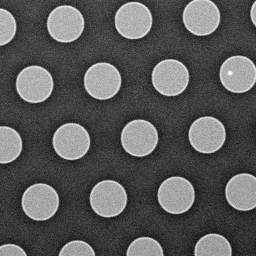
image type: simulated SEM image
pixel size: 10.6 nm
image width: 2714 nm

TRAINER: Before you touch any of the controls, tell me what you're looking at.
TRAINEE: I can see an array of small figures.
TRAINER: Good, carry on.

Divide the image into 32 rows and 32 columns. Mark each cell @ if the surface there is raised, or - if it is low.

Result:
----------------@@------@@@-----
@------@@@-----@@@@----@@@@----@
@@----@@@@----@@@@@----@@@@-----
@@----@@@@-----@@@@----@@@@-----
@@-----@@@-----@@@--------------
--------------------------------
--------------------------------
----------------------------@@@-
---@@------@@@-----@@@@-----@@@@
--@@@@-----@@@@----@@@@@----@@@@
--@@@@@----@@@@----@@@@-----@@@@
--@@@@-----@@@@-----@@@------@--
---@@---------------------------
--------------------------------
--------------------------------
----------------@@@-----@@@@----
@@-----@@@@----@@@@@----@@@@----
@@@----@@@@----@@@@@----@@@@----
@@@----@@@@-----@@@-----@@@-----
@@------@@----------------------
--------------------------------
--------------------------------
---------------------@@------@@@
----@@------@@@-----@@@@----@@@@
---@@@@----@@@@@----@@@@----@@@@
---@@@@----@@@@@----@@@@-----@@@
---@@@@-----@@@------@@---------
--------------------------------
--------------------------------
--------------------------@@----
--------@@@-----@@@@-----@@@@---
@@@-----@@@@----@@@@----@@@@@---